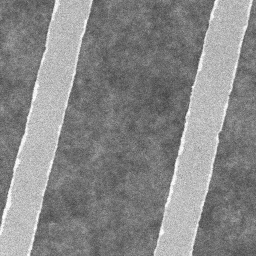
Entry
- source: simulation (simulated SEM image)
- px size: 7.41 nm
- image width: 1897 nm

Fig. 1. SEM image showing one or a few lines or trenches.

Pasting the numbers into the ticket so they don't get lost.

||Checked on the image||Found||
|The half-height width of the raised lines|260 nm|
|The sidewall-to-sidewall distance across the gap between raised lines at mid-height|120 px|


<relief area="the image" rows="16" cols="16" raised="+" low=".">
...+++.......+++
...++........++.
...++........++.
...++........++.
..+++.......+++.
..++........++..
..++........++..
..++........++..
.+++.......+++..
.++........++...
.++........++...
.++........++...
+++.......+++...
++........++++..
++........++....
++........++....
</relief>